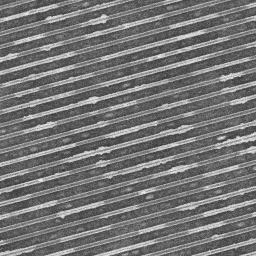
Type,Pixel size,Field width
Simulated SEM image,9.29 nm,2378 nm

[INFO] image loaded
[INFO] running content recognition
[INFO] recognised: parallel lines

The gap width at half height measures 83 nm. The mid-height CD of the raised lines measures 0.0359 µm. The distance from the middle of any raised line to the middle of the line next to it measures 118 nanometres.